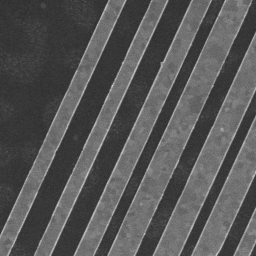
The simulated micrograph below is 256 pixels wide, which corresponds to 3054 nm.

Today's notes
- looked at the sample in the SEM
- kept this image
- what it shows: parallel lines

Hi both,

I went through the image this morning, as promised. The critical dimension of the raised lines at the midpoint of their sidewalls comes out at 205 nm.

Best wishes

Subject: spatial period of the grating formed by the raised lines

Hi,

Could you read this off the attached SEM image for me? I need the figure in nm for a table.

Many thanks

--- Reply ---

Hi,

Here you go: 444